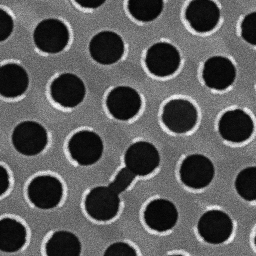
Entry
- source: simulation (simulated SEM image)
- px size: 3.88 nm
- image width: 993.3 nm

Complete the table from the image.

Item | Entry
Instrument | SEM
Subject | a regular array of holes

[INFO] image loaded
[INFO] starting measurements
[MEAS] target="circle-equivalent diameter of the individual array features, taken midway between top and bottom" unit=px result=34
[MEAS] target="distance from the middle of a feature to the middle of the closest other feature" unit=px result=56.5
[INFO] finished